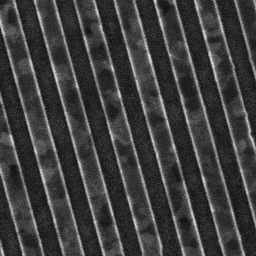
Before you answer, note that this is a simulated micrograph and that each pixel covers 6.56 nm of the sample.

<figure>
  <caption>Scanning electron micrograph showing parallel lines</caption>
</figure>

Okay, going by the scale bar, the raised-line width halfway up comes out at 19.5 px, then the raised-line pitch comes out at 254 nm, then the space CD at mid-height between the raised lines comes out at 19.4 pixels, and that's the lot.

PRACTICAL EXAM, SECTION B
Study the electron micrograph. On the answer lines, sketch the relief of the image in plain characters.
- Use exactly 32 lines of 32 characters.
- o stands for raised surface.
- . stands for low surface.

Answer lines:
oo..ooo..ooo..ooo..ooo...oo..ooo
oo...oo...oo...oo...oo...oo...oo
oo...oo...oo...oo...ooo..oo...oo
ooo..ooo..ooo..ooo..ooo..ooo..oo
ooo..ooo..ooo..ooo...oo...oo...o
.oo...oo...oo...oo...oo...oo...o
.oo...ooo..oo...ooo..ooo..ooo..o
.ooo..ooo..ooo..ooo..ooo..ooo..o
..oo...oo...oo...oo...oo...oo...
..oo...oo...oo...oo...oo...oo...
..ooo..ooo..ooo..ooo..ooo..ooo..
..ooo..ooo..ooo..ooo..ooo...oo..
...oo...oo...oo...oo...oo...oo..
...oo...oo...oo...oo...ooo..oo..
o..ooo..ooo..ooo..ooo..ooo..ooo.
o..ooo...oo...oo..ooo...oo...oo.
o...oo...oo...oo...oo...oo...oo.
oo..oo...ooo..oo...ooo..ooo..ooo
oo..ooo..ooo..ooo..ooo..ooo..ooo
oo...oo...oo...oo...oo...oo...oo
oo...oo...oo...oo...oo...oo...oo
ooo..ooo..ooo..ooo..ooo..ooo..oo
ooo..ooo..ooo..ooo..ooo..ooo...o
.oo...oo...oo...oo...oo...oo...o
.oo...oo...oo...oo...oo...oo...o
.ooo..ooo..ooo..ooo..ooo..ooo..o
.ooo...oo..ooo..ooo..ooo...oo...
..oo...oo...oo...oo...oo...oo...
..ooo..ooo..ooo..oo...ooo..ooo..
..ooo..ooo..ooo..ooo..ooo..ooo..
...oo...oo...oo...oo...oo...oo..
...oo...oo...oo...oo...oo...oo..